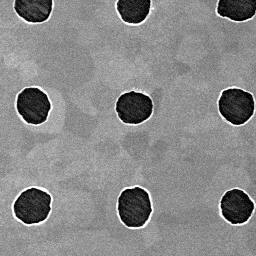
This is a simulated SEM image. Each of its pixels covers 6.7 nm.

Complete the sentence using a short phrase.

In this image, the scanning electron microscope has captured holes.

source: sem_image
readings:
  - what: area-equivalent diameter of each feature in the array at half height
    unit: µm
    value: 0.242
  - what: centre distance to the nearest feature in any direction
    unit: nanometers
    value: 674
